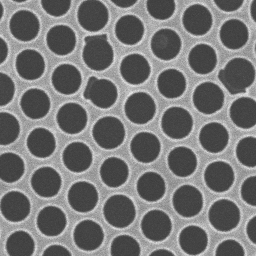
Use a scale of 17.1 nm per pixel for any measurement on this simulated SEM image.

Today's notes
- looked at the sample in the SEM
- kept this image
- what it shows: a regular array of holes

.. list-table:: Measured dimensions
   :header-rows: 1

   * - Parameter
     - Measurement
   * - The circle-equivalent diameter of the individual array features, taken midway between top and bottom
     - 529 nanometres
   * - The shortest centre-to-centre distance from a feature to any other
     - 671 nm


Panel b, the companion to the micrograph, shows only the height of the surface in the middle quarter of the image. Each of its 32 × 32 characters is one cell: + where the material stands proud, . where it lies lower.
...+++.....+++.......++++++++++.
....+++...++++........+++....+++
....++++++++++.......+++......++
....++..+++++++......++.......++
....++......++++....+++........+
....+........++++++++++........+
....+........+++++++++++......++
..+++.........+++....+++......++
+++++........+++......++++..++++
+++++++......++........+++++++++
....++++....+++........+++++++++
.....++++++++++........+++.....+
......+++++++++........++.......
......+++....+++......++........
......++......+++....+++........
.....++........+++++++++........
.....++........++++++++++.......
+..++++........+++....+++......+
+++++++........++......++++...++
++..++++.......++.......++++++++
+.....+++.....+++.......+++++.++
.......++++++++++.......+++.....
.......++++++++++.......++......
.......++++...++++.....+++......
.......+++.....++++...++++......
.......++.......++++++++++......
+.....+++.......+++++++++++.....
+++++++++.......++++....++++....
+++++++++.......+++......+++++++
+++...++++.....+++.......+++++++
++.....++++...++++.......++++...
+.......++++++++++.......+++....